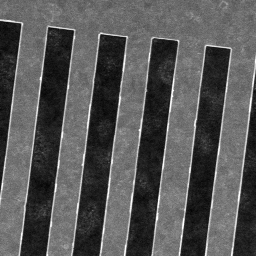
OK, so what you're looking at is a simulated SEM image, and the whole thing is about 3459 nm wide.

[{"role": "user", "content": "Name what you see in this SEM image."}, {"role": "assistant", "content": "parallel lines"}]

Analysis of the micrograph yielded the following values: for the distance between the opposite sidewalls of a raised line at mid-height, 0.355 um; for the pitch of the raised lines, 712 nm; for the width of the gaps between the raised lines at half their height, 367 nm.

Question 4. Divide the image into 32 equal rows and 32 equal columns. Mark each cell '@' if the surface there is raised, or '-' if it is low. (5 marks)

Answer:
@@@@@@@@@@@@@@@@@@@@@@@@@@@@@@@@
@@@@@@@@@@@@@@@@@@@@@@@@@@@@@@@@
@@@@@@@@@@@@@@@@@@@@@@@@@@@@@@@@
---@@@-@@@@@@@@@@@@@@@@@@@@@@@@@
---@@@---@@@@-@@@@@@@@@@@@@@@@@@
--@@@@---@@@----@@@---@@@@@@@@@@
--@@@@---@@@----@@@---@@@@---@@@
--@@@----@@@---@@@@---@@@----@@@
--@@@----@@@---@@@@---@@@----@@@
--@@@----@@@---@@@----@@@---@@@@
--@@@---@@@@---@@@----@@@---@@@@
--@@@---@@@@---@@@---@@@@---@@@@
--@@@---@@@----@@@---@@@@---@@@-
-@@@@---@@@----@@@---@@@@---@@@-
-@@@@---@@@----@@@---@@@@---@@@-
-@@@----@@@----@@@---@@@----@@@-
-@@@----@@@---@@@@---@@@----@@@-
-@@@----@@@---@@@----@@@---@@@@-
-@@@---@@@@---@@@----@@@---@@@@-
-@@@---@@@@---@@@---@@@@---@@@@-
-@@@---@@@@---@@@---@@@@---@@@--
@@@@---@@@----@@@---@@@@---@@@--
@@@@---@@@----@@@---@@@@---@@@--
@@@----@@@----@@@---@@@@---@@@--
@@@----@@@---@@@@---@@@----@@@--
@@@----@@@---@@@@---@@@---@@@@--
@@@---@@@@---@@@----@@@---@@@@--
@@@---@@@@---@@@----@@@---@@@@--
@@@---@@@----@@@---@@@@---@@@---
@@@---@@@----@@@---@@@@---@@@---
@@@---@@@----@@@---@@@@---@@@---
@@@---@@@----@@@---@@@@---@@@---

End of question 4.